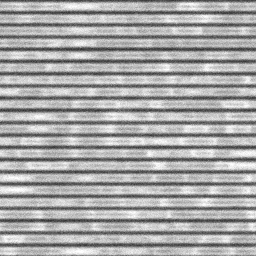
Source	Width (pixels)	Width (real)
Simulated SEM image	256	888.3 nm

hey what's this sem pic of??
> parallel lines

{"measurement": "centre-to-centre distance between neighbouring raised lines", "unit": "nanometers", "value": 42.5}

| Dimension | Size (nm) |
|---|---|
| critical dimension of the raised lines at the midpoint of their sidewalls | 25.6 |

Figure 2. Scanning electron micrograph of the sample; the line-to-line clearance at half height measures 16 nanometers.